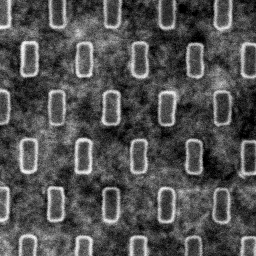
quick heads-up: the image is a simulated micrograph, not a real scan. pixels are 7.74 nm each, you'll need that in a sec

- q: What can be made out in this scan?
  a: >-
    a regular array of raised bodies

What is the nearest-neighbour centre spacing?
0.426 micrometres